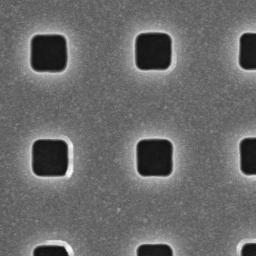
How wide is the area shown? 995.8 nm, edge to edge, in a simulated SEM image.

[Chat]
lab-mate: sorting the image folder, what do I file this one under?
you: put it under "holes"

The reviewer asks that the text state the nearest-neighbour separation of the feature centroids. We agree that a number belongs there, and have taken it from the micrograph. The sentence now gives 405 nanometres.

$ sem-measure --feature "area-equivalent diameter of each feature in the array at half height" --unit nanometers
154